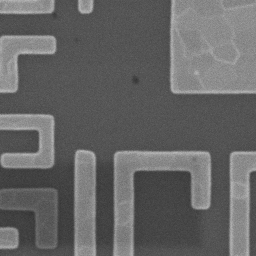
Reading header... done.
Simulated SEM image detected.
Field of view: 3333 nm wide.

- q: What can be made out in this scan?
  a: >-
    wiring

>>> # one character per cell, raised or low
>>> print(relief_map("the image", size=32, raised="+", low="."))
+++++++...+...........++++++++++
++++++....+...........++++++++++
.....................+++++++++++
.....................+++++++++++
.....................+++++++++++
+++++++..............+++++++++++
+++++++..............+++++++++++
++...................+++++++++++
++...................+++++++++++
++...................+++++++++++
++...................+++++++++++
++....................++++++++++
................................
................................
++++++..........................
+++++++.........................
.....++.........................
.....++.........................
.....++.........................
+++++++..+++..++++++++++++...+++
+++++++..+++..++++++++++++...+++
.........+++..+++.......++...++.
.........+++..+++.......++...++.
.........+++..+++.......++...++.
+++++++..+++..+++.......++...++.
+++++++..+++..+++.......++...++.
....+++..+++..+++............++.
....+++..+++..+++............++.
++...++..+++..+++............++.
++...++..+++..+++............++.
++...++..+++..+++............++.
.........+++..+++............++.